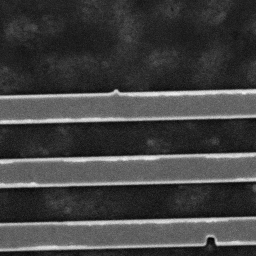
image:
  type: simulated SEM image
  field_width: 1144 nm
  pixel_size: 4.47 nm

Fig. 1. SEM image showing parallel lines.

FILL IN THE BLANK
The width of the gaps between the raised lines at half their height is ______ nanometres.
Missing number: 169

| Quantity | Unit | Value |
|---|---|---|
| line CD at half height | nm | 116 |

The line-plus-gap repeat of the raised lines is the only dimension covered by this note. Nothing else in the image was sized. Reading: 0.284 micrometres